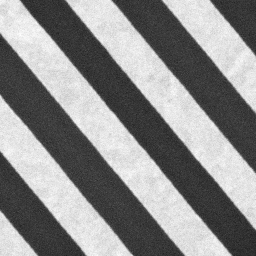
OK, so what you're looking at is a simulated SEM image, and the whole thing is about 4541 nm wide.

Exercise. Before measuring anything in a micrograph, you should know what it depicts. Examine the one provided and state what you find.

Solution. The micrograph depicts lines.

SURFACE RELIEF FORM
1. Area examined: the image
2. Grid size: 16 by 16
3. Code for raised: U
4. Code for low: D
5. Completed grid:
UUDDDUUDDDDUUDDD
UUDDDUUUDDDUUUDD
UUUDDDUUUDDDUUUD
DUUUDDDUUUDDDUUU
DDUUUDDDUUUDDDUU
DDDUUUDDDUUUDDDU
DDDDUUUDDUUUDDDD
UDDDDUUDDDUUUDDD
UUDDDUUUDDDUUUDD
UUUDDDUUUDDDUUUD
DUUUDDDUUUDDDUUU
DDUUUDDDUUUDDDUU
DDDUUDDDDUUUDDUU
DDDUUUDDDDUUDDDU
UDDDUUUDDDUUUDDD
UUDDDUUUDDDUUUDD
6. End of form